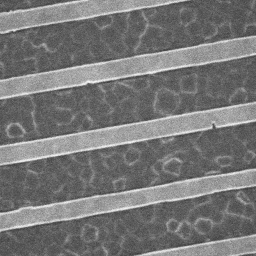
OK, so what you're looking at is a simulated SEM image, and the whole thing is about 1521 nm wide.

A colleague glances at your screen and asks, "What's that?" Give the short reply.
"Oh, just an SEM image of one or a few lines or trenches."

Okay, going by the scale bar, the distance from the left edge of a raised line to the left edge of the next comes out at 387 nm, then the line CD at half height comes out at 103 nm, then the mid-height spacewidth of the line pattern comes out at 0.286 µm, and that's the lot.